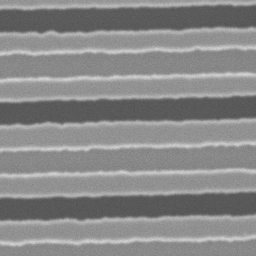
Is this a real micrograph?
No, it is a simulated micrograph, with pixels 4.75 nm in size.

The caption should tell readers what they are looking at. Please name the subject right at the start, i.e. lines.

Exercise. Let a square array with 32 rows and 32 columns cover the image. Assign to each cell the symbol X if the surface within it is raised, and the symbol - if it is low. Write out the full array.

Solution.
XXXXXXXXXXXXXXXXXXXXXXXXXXXX-XXX
--------------------------------
--------------------------------
---------------------------X---X
XXXXXXXXXXXXXXXXXXXXXXXXXXXXXXXX
XXXXXXXXXXXXXXXXXXXXXXXXXXXXXXXX
XXXXXXXXXXXXXXXXXXXXXXXXXXXXXXXX
XXXXXXXXXXXXXXXXXXXXXXXXXXXXXXXX
XXXXXXXXXXXXXXXXXXXXXXXXXXXXXXXX
XXXXXXXXXXXXXXXXXXXXXXXXXXXXXXXX
XXXXXXXXXXXXXXXXXXXXXXXXXXXXXXXX
XXXXXXXXXXXXXXXXXXXXXXXXXXXXXXXX
XXXXX---------------------------
--------------------------------
--------------------------------
-----XX-XXXXXXXXXXXXXXXXXXXXXXXX
XXXXXXXXXXXXXXXXXXXXXXXXXXXXXXXX
XXXXXXXXXXXXXXXXXXXXXXXXXXXXXXXX
XXXXXXXXXXXXXXXXXXXXXXXXXXXXXXXX
XXXXXXXXXXXXXXXXXXXXXXXXXXXXXXXX
XXXXXXXXXXXXXXXXXXXXXXXXXXXXXXXX
XXXXXXXXXXXXXXXXXXXXXXXXXXXXXXXX
XXXXXXXXXXXXXXXXXXXXXXXXXXXXXXXX
XXXXXXXXXXXXXXXXXXXXXXXXXXXXXXXX
XXXXXXX-XX-X--------------------
--------------------------------
--------------------------------
-------XXX-XXXXXXXXXXXXXXXXXXXXX
XXXXXXXXXXXXXXXXXXXXXXXXXXXXXXXX
XXXXXXXXXXXXXXXXXXXXXXXXXXXXXXXX
XXXXXXXXXXXXXXXXXXXXXXXXXXXXXXXX
XXXXXXXXXXXXXXXXXXXXXXXXXXXXXXXX